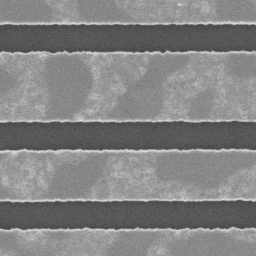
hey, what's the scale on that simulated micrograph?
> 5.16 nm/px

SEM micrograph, lines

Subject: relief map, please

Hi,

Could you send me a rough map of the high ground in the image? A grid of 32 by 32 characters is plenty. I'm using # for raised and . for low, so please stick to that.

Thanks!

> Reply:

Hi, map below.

################################
################################
################################
................................
................................
................................
....##....#....#...#...####..###
################################
################################
################################
################################
################################
################################
################################
################################
................................
................................
................................
................................
################################
################################
################################
################################
################################
################################
................................
................................
................................
................................
################################
################################
################################